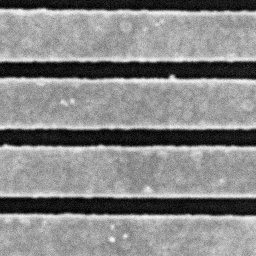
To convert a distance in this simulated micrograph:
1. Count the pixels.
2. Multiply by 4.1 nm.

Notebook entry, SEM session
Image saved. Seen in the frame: lines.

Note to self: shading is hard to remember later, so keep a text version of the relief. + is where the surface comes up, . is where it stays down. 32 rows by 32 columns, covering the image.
................................
+++++++++++++++++++++++..+..+.+.
++++++++++++++++++++++++++++++++
++++++++++++++++++++++++++++++++
++++++++++++++++++++++++++++++++
++++++++++++++++++++++++++++++++
++++++++++++++++++++++++++++++++
++++++++++++++++++++++++++++++++
................................
................................
++++++++++++++++++++++++++++++++
++++++++++++++++++++++++++++++++
++++++++++++++++++++++++++++++++
++++++++++++++++++++++++++++++++
++++++++++++++++++++++++++++++++
++++++++++++++++++++++++++++++++
................................
................................
++++++++++++++++++++++++++++++++
++++++++++++++++++++++++++++++++
++++++++++++++++++++++++++++++++
++++++++++++++++++++++++++++++++
++++++++++++++++++++++++++++++++
++++++++++++++++++++++++++++++++
++++++++++++++++++++++++++++++++
................................
................................
++++++++++++++++++++++++++++++++
++++++++++++++++++++++++++++++++
++++++++++++++++++++++++++++++++
++++++++++++++++++++++++++++++++
++++++++++++++++++++++++++++++++